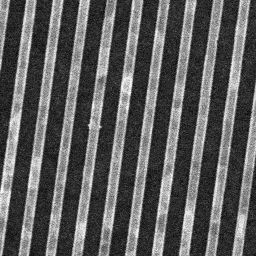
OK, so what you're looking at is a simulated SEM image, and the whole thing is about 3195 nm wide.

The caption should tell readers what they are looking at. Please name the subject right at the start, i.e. parallel lines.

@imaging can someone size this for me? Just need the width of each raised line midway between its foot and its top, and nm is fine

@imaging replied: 110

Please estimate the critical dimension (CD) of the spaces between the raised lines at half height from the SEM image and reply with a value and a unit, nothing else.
220 nanometres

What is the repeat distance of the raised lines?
330 nm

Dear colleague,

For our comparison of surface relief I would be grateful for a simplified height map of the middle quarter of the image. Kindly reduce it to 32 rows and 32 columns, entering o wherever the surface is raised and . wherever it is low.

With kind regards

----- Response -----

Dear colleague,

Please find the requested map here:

..oo.....oo....oo.....oo.....oo.
..oo....oo.....oo.....oo.....o..
..oo....oo.....oo.....oo.....o..
..oo....oo.....oo....ooo....oo..
.oo.....oo.....oo....oo.....oo..
.oo.....oo.....oo....oo.....oo..
.oo.....oo....oo.....oo.....oo..
.oo.....oo....oo.....oo.....oo..
.oo....ooo....oo.....oo.....oo..
.oo....oo.....oo.....oo....oo...
.oo....oo.....oo.....oo....oo...
oo.....oo.....oo....oo.....oo...
oo.....oo.....oo....oo.....oo...
oo.....oo....ooo....oo.....oo...
oo.....oo....oo.....oo.....oo...
oo....ooo....oo.....oo.....oo...
oo.....o.....oo.....oo....oo....
oo.....o.....oo.....oo....oo....
oo....oo.....oo....ooo....oo....
o.....oo.....oo....oo.....oo....
o.....oo.....oo....oo.....oo....
o.....oo....oo.....oo.....oo....
o.....oo....oo.....oo.....oo....
o.....oo....oo.....oo....oo.....
o.....o.....oo.....oo....oo.....
o....oo.....oo.....oo....oo.....
.....oo.....oo....oo.....oo.....
.....oo.....oo....oo.....oo.....
.....oo....ooo....oo.....oo.....
.....oo....oo.....oo.....oo.....
.....oo....oo.....oo....ooo....o
.....o.....oo.....oo....oo.....o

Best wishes